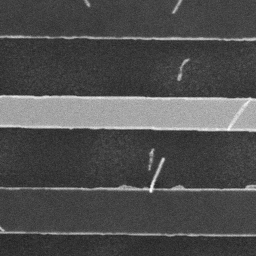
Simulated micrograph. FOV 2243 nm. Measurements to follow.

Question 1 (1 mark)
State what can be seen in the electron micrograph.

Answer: lines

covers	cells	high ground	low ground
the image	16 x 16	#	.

################
################
..............##
................
................
................
################
################
................
................
................
................
################
################
################
................